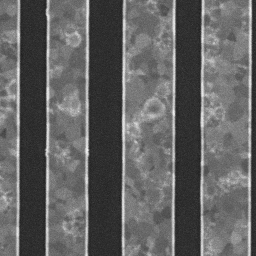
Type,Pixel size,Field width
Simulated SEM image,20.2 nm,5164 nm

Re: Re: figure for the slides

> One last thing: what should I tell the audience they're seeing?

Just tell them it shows one or a few lines or trenches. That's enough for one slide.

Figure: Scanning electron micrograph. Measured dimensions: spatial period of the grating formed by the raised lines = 1600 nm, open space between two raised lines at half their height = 588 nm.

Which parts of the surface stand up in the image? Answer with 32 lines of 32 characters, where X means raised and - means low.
XX----XXXXX-----XXXXXX---XXXXXX-
XX----XXXXX-----XXXXXX---XXXXXX-
XX----XXXXX-----XXXXXX---XXXXXX-
XX----XXXXX-----XXXXXX---XXXXXX-
XX----XXXXX-----XXXXXX---XXXXXX-
XX----XXXXX-----XXXXXX---XXXXXX-
XX----XXXXX-----XXXXXX---XXXXXX-
XX----XXXXX-----XXXXXX---XXXXXX-
XX----XXXXX----XXXXXXX---XXXXXX-
XX----XXXXX----XXXXXXX---XXXXXX-
XX----XXXXX----XXXXXXX---XXXXXX-
XX----XXXXX-----XXXXXX---XXXXXX-
XX----XXXXX----XXXXXXX---XXXXXX-
XX----XXXXX-----XXXXXX---XXXXXX-
XX----XXXXX----XXXXXXX---XXXXXX-
XX----XXXXX----XXXXXXX---XXXXXX-
XX----XXXXX----XXXXXXX---XXXXXX-
XX----XXXXX-----XXXXXX---XXXXXX-
XX----XXXXX-----XXXXXX---XXXXXX-
XX----XXXXX-----XXXXXX---XXXXXX-
XX----XXXXX-----XXXXXX---XXXXXX-
XX----XXXXX----XXXXXXX---XXXXXX-
XX----XXXXX----XXXXXXX---XXXXXX-
XX----XXXXX----XXXXXXX---XXXXXX-
XX----XXXXX----XXXXXXX---XXXXXX-
XX----XXXXX----XXXXXXX---XXXXXX-
XX----XXXXX----XXXXXXX---XXXXXX-
XX----XXXXX----XXXXXXX---XXXXXX-
XX----XXXXX----XXXXXXX---XXXXXX-
XX----XXXXX----XXXXXXX---XXXXXX-
XX----XXXXX----XXXXXXX---XXXXXX-
XX----XXXXX----XXXXXXX---XXXXXX-